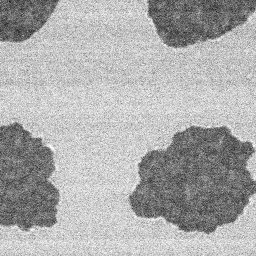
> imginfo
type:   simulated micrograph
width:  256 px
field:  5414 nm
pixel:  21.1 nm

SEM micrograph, raised bodies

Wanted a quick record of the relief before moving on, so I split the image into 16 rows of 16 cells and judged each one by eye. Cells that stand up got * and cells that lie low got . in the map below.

****.....*******
***.......*****.
**........***...
................
................
................
................
................
**.........****.
***......*******
***......*******
***......*******
****....********
****.....******.
............*...
................